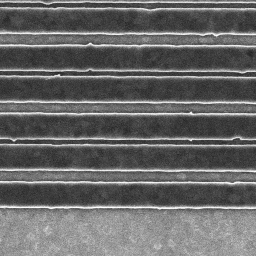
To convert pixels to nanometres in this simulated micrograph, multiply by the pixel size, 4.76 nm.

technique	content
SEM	parallel lines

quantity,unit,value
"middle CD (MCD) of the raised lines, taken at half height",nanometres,124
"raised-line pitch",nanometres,165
